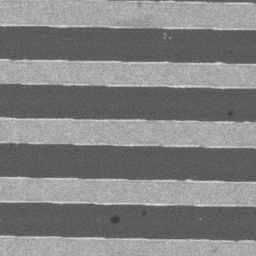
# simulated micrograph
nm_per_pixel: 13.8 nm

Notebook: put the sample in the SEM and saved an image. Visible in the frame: lines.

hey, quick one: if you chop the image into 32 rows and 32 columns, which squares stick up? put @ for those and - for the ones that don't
@@@@@@@@@@@@@@@@@@@@@@@@@@@@@@@@
@@@@@@@@@@@@@@@@@@@@@@@@@@@@@@@@
@@@@@@@@@@@@@@@@@@@@@@@@@@@@@@@@
-------------------@@@@@@@@@@@@@
--------------------------------
--------------------------------
--------------------------------
@@------------------------------
@@@@@@@@@@@@@@@@@@@@@@@@@@@@@@@@
@@@@@@@@@@@@@@@@@@@@@@@@@@@@@@@@
--------@@@@@@@@@@@@@@@@@@@@@@@@
--------------------------------
--------------------------------
--------------------------------
--------------------------------
@@@@@@@@@@@@@@@@@@@@@@@@@@@@@@@@
@@@@@@@@@@@@@@@@@@@@@@@@@@@@@@@@
@@@@@@@@@@@@@@@@@@@@@@@@@@@@@@@@
--------------------------------
--------------------------------
--------------------------------
--------------------------------
@@@@@@@@@@@@@@@@----------------
@@@@@@@@@@@@@@@@@@@@@@@@@@@@@@@@
@@@@@@@@@@@@@@@@@@@@@@@@@@@@@@@@
------------------@@@@@@@@@@@@@@
--------------------------------
--------------------------------
--------------------------------
--------------------------------
@@@@@@@@@@@@@@@@@@@@@@@@@@@@@@@@
@@@@@@@@@@@@@@@@@@@@@@@@@@@@@@@@